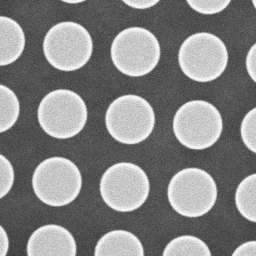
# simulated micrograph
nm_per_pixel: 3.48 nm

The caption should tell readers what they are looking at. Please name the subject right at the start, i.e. an array of small figures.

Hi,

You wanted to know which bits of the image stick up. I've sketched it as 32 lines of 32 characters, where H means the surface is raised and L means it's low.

LLLLLLLLLLLLLLLLHHHLLLLLHHHHLLLL
LLLLLLLLLLLLLLLLLLLLLLLLLHHLLLLL
HHLLLLLLLLLLLLLLLLLLLLLLLLLLLLLL
HHHLLLLHHHLLLLLLHLLLLLLLLLLLLLLL
HHHLLLHHHHHLLLLHHHHLLLLLHHHLLLLL
HHHLLHHHHHHLLLHHHHHHLLLHHHHHLLLL
HHHLLLHHHHHLLLHHHHHHLLHHHHHHLLLH
HHLLLLHHHHHLLLHHHHHHLLHHHHHHLLLH
LLLLLLLHHHLLLLLHHHHLLLLHHHHHLLLH
LLLLLLLLLLLLLLLLLLLLLLLHHHHLLLLH
LLLLLLLLLLLLLLLLLLLLLLLLLLLLLLLL
HHLLLLLHHLLLLLLLLLLLLLLLLLLLLLLL
HHLLLHHHHHLLLLHHHHLLLLLLLLLLLLLL
HHLLLHHHHHHLLLHHHHHLLLLHHHHLLLLL
HHLLLHHHHHHLLHHHHHHLLLHHHHHHLLLH
HHLLLHHHHHHLLHHHHHHLLLHHHHHHLLHH
LLLLLLHHHHLLLLHHHHHLLLHHHHHHLLHH
LLLLLLLLLLLLLLLHHHLLLLHHHHHLLLHH
LLLLLLLLLLLLLLLLLLLLLLLLHHLLLLLH
LLLLLLLLLLLLLLLLLLLLLLLLLLLLLLLL
HLLLLHHHHLLLLLLHLLLLLLLLLLLLLLLL
HHLLHHHHHHLLLHHHHHLLLLHHHHLLLLLL
HHLLHHHHHHLLLHHHHHLLLHHHHHHLLLHH
HLLLHHHHHHLLLHHHHHHLLHHHHHHLLLHH
LLLLLHHHHLLLLHHHHHLLLHHHHHHLLHHH
LLLLLLHHLLLLLHHHHHLLLHHHHHHLLLHH
LLLLLLLLLLLLLLLLLLLLLLHHHHLLLLHH
LLLLLLLLLLLLLLLLLLLLLLLLLLLLLLLH
LLLLLHHHLLLLLLLLLLLLLLLLLLLLLLLL
HLLLHHHHHLLLLHHHHLLLLLLLLLLLLLLL
HLLHHHHHHLLLHHHHHHLLLHHHHHLLLLHH
HLLHHHHHHLLLHHHHHHLLHHHHHHLLLHHH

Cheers